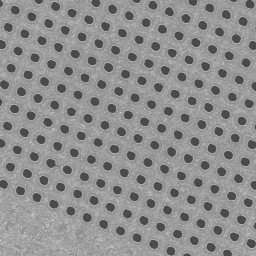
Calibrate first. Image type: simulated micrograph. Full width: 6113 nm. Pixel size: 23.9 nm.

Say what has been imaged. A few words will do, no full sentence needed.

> a regular array of holes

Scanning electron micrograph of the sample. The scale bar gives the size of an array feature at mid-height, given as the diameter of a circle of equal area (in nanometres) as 217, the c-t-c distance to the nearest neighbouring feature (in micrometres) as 0.427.